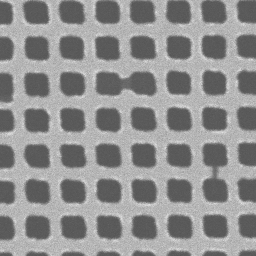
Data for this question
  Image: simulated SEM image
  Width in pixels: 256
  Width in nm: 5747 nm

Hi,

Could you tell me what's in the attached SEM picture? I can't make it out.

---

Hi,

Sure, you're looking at a regular array of holes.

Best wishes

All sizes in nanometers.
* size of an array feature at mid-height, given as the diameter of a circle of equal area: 612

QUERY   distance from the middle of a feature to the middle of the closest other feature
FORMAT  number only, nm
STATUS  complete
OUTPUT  794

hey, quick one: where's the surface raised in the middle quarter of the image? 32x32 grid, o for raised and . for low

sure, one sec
oooooooooooooooooooooooooooooooo
oooooooooooooooooooooooooooooooo
.....ooo......ooo.....oooo.....o
.....ooo...............oo.......
.....ooo...............oo.......
.....ooo...............oo.......
.....ooo.......o.......ooo......
.....oooo.....oooo.....oooo....o
oooooooooooooooooooooooooooooooo
oooooooooooooooooooooooooooooooo
oooooooooooooooooooooooooooooooo
.....ooo......ooo......ooo.....o
.....ooo......oo.......oo.......
.....ooo......ooo......oo.......
.....ooo......ooo......oo.......
.....ooo......ooo......ooo......
.....oooo.....oooo.....ooo......
oooooooooooooooooooooooooooooooo
oooooooooooooooooooooooooooooooo
oooooooooooooooooooooooooooooooo
.....ooo......ooo......ooo.....o
.....ooo......ooo......ooo......
.....ooo......ooo......ooo......
.....ooo.......oo......ooo......
......oo.......oo......ooo......
.....oooo.....oooo.....oooo.....
oooooooooooooooooooooooooooooooo
oooooooooooooooooooooooooooooooo
ooooooooooooooooooooooooooo.oooo
.....ooo......ooo......ooo.....o
......oo......ooo......ooo......
......oo.......oo......ooo......